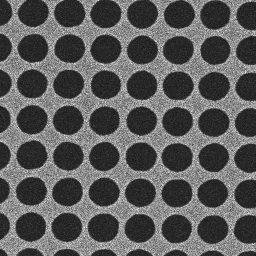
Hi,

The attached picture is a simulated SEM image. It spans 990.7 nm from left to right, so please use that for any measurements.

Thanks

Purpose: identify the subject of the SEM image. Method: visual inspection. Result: a regular array of holes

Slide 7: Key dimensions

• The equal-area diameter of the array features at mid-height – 114 nm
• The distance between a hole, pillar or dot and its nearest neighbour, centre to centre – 138 nm